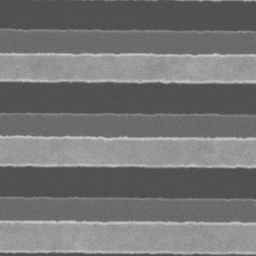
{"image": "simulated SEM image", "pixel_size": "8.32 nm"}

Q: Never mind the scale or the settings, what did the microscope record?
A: lines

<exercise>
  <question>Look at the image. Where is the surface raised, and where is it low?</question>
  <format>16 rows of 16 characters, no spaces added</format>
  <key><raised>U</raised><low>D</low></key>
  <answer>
DDDDDDDDDDDDDDDD
DDDDDDDDDDDDDDDD
UUUUUUUUUUUUUUUU
UUUUUUUUUUUUUUUU
UUUUUUUUUUUUUUUU
DDDDDDDDDDDDDDDD
DDDDDDDDDDDDDDDD
UUUUUUUUUUUUUUUU
UUUUUUUUUUUUUUUU
UUUUUUUUUUUUUUUU
DDDDDDDDDDDDDDDD
DDDDDDDDDDDDDDDD
UUUUUUUUUUUUUUUU
UUUUUUUUUUUUUUUU
UUUUUUUUUUUUUUUU
UUUUUUUUUUUUUUUU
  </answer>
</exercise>